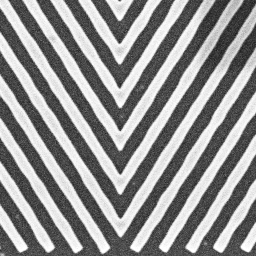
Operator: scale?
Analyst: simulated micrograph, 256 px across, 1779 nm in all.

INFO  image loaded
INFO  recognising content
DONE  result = groups of lines, slits or small figures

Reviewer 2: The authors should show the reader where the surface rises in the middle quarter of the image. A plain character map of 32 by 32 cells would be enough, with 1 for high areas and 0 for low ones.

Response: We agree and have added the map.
11100001110000000011000001100001
01110000111000000111000011100001
00110000011100000110000111000011
00111000011100001110000111000011
00011100001110011100001110000111
00001100000110011100011100001110
00001110000111111000011100001110
10000111000011110000111000011100
11000011000001110000110000011000
11000011100001100001110000111000
11100001110000000011100001110000
11100000110000000011100001100001
01110000111000000111000011100001
00111000011100001110000111000011
00111000011100001110000110000011
00011100001110011100001110000111
00001110000111011000011100001110
00001110000111111000011100001100
10000111000011110000111000011100
11000011000001100000110000011000
11000011100001100001110000111000
11100001110000000011100001110000
01100000110000000011100011110001
00110000111000000111000011100001
00111000011100001110000111000011
00011000011100001100000111000011
00011100001110011100001110000111
00001110000111111000011100001110
10000110000111111000011100001100
10000111000011110000111000011100
11000011100001100000110000111000
11000011100001100001110000110000